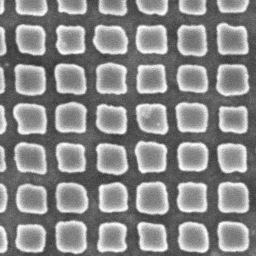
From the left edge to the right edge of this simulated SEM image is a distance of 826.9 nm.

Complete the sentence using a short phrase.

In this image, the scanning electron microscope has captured a regular array of raised bodies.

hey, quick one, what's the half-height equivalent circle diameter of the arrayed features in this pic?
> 102 nm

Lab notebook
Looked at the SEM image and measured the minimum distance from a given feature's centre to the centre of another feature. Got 126 nm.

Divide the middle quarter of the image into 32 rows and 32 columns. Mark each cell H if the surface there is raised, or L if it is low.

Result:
HHHLLLLLLHHHHHHLLLLHHHHHHLLLLLHH
HHHHHLLLHHHHHHHLLLLHHHHHHLLLLHHH
HHHHHLLLHHHHHHHLLLLHHHHHHLLLHHHH
HHHHHLLLHHHHHHHLLLHHHHHHHLLLHHHH
HHHHHLLLHHHHHHHLLLHHHHHHHLLLHHHH
HHHHHLLLHHHHHHHLLLHHHHHHHHLLLHHH
HHHHHLLLHHHHHHHLLLLHHHHHHLLLLLHH
LLLHLLLLLLLLLLLLLLLLLLLLLLLLLLLL
LLLLLLLLLLLLLLLLLLLLLLLLLLLLLLLL
LLLLLLLLLLLLLLLLLLLLLLLLLLLLLLLL
HHHHHLLLLHHLLLLLLLLHHHHHHLLLHHHH
HHHHHHLLHHHHHHHLLLHHHHHHHLLLHHHH
HHHHHLLLHHHHHHHLLLHHHHHHHLLLHHHH
HHHHHLLLHHHHHHHLLLHHHHHHHLLLHHHH
HHHHHLLLHHHHHHHLLLLHHHHHHHLLHHHH
HHHHHLLLHHHHHHHLLLLHHHHHHHLLLHHH
HHHHHLLLLHHHHHHLLLLLHHHHHHLLLHHH
LLLLLLLLLLLLLLLLLLLLLLLLHLLLLLLL
LLLLLLLLLLLLLLLLLLLLLLLLLLLLLLLL
LLLLLLLLLLLLLLLLLLLLLLLLLLLLLLLL
HHHHLLLLLHHHHHLLLLHHHHHHHLLLLHHH
HHHHHLLLHHHHHHHLLLHHHHHHHLLLHHHH
HHHHHLLLHHHHHHHLLLHHHHHHHLLLHHHH
HHHHHLLLHHHHHHHHLLHHHHHHHLLLLHHH
HHHHHLLLHHHHHHHHLLLHHHHHHLLLLHHH
HHHHHLLLHHHHHHHHLLLHHHHHHLLLLHHH
HHHHHLLLLHHHHHHHLLLHHHHHHLLLLLHH
LLLLLLLLLLLLHHLLLLLLLLLLLLLLLLLL
LLLLLLLLLLLLLLLLLLLLLLLLLLLLLLLL
LLLLLLLLLLLLLLLLLLLLLLLLLLLLLLLL
HHHHHLLLLHHHHHHLLLLHHHHHHLLLLHHH
HHHHHLLLLHHHHHHHLLHHHHHHHLLLLHHH